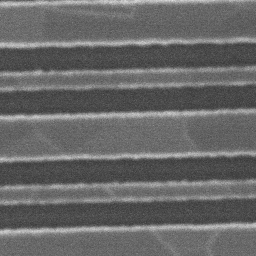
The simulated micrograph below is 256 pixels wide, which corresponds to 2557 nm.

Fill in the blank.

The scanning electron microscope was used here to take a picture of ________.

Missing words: lines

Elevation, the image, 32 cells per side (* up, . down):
********************************
********************************
********************************
********************************
********************************
****************.*..............
................................
................................
.............................***
********************************
*******************************.
................................
................................
................................
..******************************
********************************
********************************
********************************
********************************
*************************.*.....
................................
................................
................................
********************************
********************************
................................
................................
................................
.........***********************
********************************
********************************
********************************